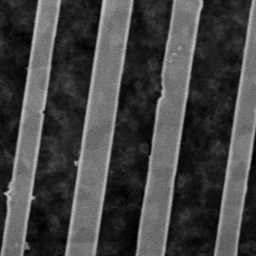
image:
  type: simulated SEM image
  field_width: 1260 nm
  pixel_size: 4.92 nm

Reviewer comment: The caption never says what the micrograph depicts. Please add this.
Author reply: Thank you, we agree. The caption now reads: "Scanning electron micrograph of one or a few lines or trenches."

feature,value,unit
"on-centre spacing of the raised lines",342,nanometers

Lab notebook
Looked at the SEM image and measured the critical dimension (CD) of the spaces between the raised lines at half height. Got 0.218 um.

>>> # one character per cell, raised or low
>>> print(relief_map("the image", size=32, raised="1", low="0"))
00000110000001110000001110000000
00000110000001110000001110000001
00000110000001110000011110000001
00001110000011110000011110000001
00001110000011110000011100000001
00001110000011110000011100000001
00001100000011110000011100000001
00001100000011100000011100000001
00001100000011100000111100000011
00001100000011100000111100000011
00011100000111100000111100000011
00011100000111100000111000000011
00011100000111100000111000000011
00011000000111000000111000000011
00011000000111000000111000000011
00011000000111000001111000000111
00111000000111000001111000000111
00111000001111000001110000000111
00111000001111000001110000000110
00111000001111000001110000000110
00110000001110000001110000000110
00110000001110000001110000001110
00110000001110000001110000001110
01110000001110000011110000001110
01110000011110000011100000001110
01110000011110000011100000001100
01100000011110000011100000001100
01100000011100000011100000001100
01100000011100000111100000011100
01100000011100000111100000011100
11100000111100000111100000011100
11100000111100000111000000011000